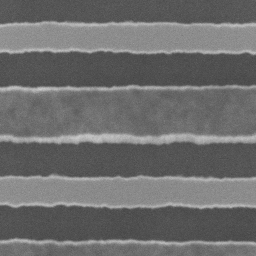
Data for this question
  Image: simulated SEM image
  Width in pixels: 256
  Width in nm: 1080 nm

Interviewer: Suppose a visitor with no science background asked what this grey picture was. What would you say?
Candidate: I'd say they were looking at lines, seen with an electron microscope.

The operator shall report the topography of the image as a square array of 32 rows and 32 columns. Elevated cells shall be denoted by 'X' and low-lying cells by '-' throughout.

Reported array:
--------------------------------
--------------------------------
--------------------------------
XXXXXXXXXXXXXXXXXXXXXXXXXXXXXXXX
XXXXXXXXXXXXXXXXXXXXXXXXXXXXXXXX
XXXXXXXXXXXXXXXXXXXXXXXXXXXXXXXX
XXX--------X--X-XXXXXX-XXXXXXXXX
--------------------------------
--------------------------------
--------------------------------
--------------------------------
XXXXXXXXXXXXXXXXXXXXXXXXXXXXXXXX
XXXXXXXXXXXXXXXXXXXXXXXXXXXXXXXX
XXXXXXXXXXXXXXXXXXXXXXXXXXXXXXXX
XXXXXXXXXXXXXXXXXXXXXXXXXXXXXXXX
XXXXXXXXXXXXXXXXXXXXXXXXXXXXXXXX
XXXXXXXXXXXXXXXXXXXXXXXXXXXXXXXX
--XXXXXXXX------XXXXX---XXXXXXXX
--------------------------------
--------------------------------
--------------------------------
--------------------------------
XXXXXXXXXXXXXXXXXXXXXXXXXXXXXXXX
XXXXXXXXXXXXXXXXXXXXXXXXXXXXXXXX
XXXXXXXXXXXXXXXXXXXXXXXXXXXXXXXX
XXXXXXXXXXXXXXXXXXXXXXXXXXXXXXXX
--------------------------------
--------------------------------
--------------------------------
--------------------------------
XXXXXXXXXXXXXXXXXXXXXXXXXXXXXXXX
XXXXXXXXXXXXXXXXXXXXXXXXXXXXXXXX